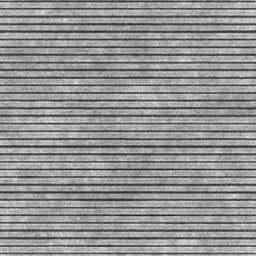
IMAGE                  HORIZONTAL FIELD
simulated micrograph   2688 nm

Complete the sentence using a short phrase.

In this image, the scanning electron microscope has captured parallel lines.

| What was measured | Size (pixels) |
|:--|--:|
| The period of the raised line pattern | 7.65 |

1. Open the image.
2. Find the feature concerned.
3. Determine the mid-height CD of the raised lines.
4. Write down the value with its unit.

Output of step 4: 49.9 nanometers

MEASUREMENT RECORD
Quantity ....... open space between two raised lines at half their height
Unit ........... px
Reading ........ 2.75